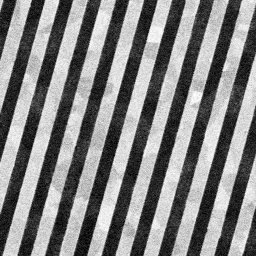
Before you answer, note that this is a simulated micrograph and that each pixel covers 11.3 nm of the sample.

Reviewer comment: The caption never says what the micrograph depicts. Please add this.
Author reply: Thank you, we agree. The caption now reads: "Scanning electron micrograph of parallel lines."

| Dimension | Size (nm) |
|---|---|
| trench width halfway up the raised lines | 161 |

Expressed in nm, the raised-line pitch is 307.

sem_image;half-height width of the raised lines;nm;146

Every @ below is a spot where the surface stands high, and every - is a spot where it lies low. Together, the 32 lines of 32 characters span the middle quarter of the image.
@----@@@----@@@----@@@----@@@---
@----@@@----@@@----@@@----@@@---
@---@@@@---@@@@----@@@----@@@---
----@@@----@@@----@@@@---@@@@---
----@@@----@@@----@@@----@@@----
----@@@----@@@----@@@----@@@----
---@@@@---@@@@---@@@@---@@@@---@
@--@@@----@@@----@@@----@@@----@
---@@@----@@@----@@@----@@@----@
--@@@@---@@@@----@@@----@@@----@
--@@@----@@@----@@@@---@@@@---@@
--@@@----@@@----@@@----@@@----@@
--@@@----@@@----@@@----@@@----@@
-@@@@---@@@@----@@@----@@@----@@
-@@@----@@@----@@@----@@@@---@@@
-@@@----@@@----@@@----@@@----@@@
-@@@----@@@----@@@----@@@----@@@
@@@@---@@@@---@@@@---@@@@---@@@@
@@@----@@@----@@@----@@@----@@@-
@@@----@@@----@@@----@@@----@@@-
@@@---@@@@----@@@----@@@----@@@-
@@----@@@----@@@@---@@@@---@@@@-
@@----@@@----@@@----@@@----@@@--
@@----@@@----@@@----@@@----@@@--
@@---@@@@---@@@@---@@@@---@@@@--
@----@@@----@@@----@@@----@@@---
@----@@@----@@@----@@@----@@@---
@----@@@----@@@----@@@----@@@---
@---@@@@---@@@@---@@@@---@@@@---
----@@@----@@@----@@@----@@@----
----@@@----@@@----@@@----@@@----
---@@@@---@@@@----@@@----@@@----